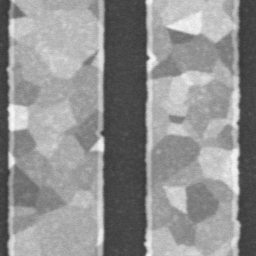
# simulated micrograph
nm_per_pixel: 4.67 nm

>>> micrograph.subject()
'one or a few lines or trenches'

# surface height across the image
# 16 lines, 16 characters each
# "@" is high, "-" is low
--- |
-@@@@@---@@@@@@-
-@@@@@---@@@@@@-
-@@@@@---@@@@@@-
-@@@@@---@@@@@@-
-@@@@@---@@@@@@-
-@@@@@---@@@@@@-
-@@@@@---@@@@@@-
-@@@@@---@@@@@@-
-@@@@@---@@@@@@-
-@@@@@---@@@@@@-
-@@@@@---@@@@@@-
-@@@@@---@@@@@@-
-@@@@@---@@@@@@-
-@@@@@---@@@@@@-
-@@@@@---@@@@@@-
-@@@@@---@@@@@@-